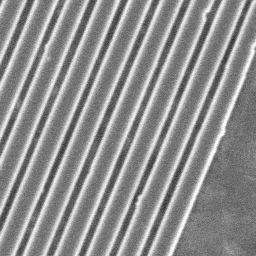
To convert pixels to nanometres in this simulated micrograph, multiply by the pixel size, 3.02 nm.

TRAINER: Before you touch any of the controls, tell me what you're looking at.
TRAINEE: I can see parallel lines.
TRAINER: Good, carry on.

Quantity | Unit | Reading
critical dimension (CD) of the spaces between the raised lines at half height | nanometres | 23.4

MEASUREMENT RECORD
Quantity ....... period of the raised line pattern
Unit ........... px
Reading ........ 29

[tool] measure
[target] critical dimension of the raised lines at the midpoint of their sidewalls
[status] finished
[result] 62.5 nm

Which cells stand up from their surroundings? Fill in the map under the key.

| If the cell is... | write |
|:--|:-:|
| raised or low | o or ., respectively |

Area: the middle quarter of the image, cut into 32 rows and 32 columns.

..ooooo..oooooo..oooooo..oooooo.
.oooooo..oooooo..ooooo...ooooo..
.ooooo..oooooo...ooooo..oooooo..
oooooo..oooooo..oooooo..oooooo..
oooooo..ooooo...ooooo..oooooo..o
ooooo..oooooo..oooooo..oooooo..o
ooooo..ooooo...ooooo...ooooo..oo
oooo..oooooo..oooooo..oooooo..oo
oooo..oooooo..oooooo..ooooo...oo
oooo..ooooo...ooooo..oooooo..ooo
ooo..oooooo..oooooo..oooooo..ooo
ooo..ooooo...ooooo..oooooo..oooo
oo..oooooo..oooooo..oooooo..oooo
oo..oooooo..oooooo..ooooo...oooo
oo.oooooo...ooooo..oooooo..ooooo
o..oooooo..oooooo..oooooo..ooooo
o..ooooo...ooooo..oooooo..oooooo
..oooooo..oooooo..oooooo..ooooo.
..ooooo...ooooo...ooooo..oooooo.
..ooooo..oooooo..oooooo..oooooo.
.oooooo..oooooo..oooooo..ooooo..
.ooooo...ooooo..oooooo..oooooo..
oooooo..oooooo..oooooo..ooooo...
ooooo...ooooo...ooooo..oooooo..o
ooooo..oooooo..oooooo..oooooo..o
ooooo..oooooo..ooooo...ooooo..oo
oooo...ooooo..oooooo..oooooo..oo
oooo..oooooo..oooooo..ooooo...oo
ooo...ooooo...ooooo..oooooo..ooo
ooo..oooooo..oooooo..ooooo...ooo
ooo..ooooo...ooooo...ooooo..oooo
oo...ooooo..oooooo..oooooo..oooo